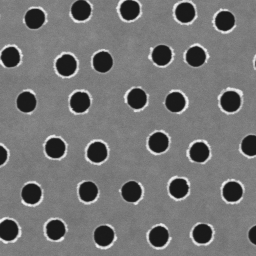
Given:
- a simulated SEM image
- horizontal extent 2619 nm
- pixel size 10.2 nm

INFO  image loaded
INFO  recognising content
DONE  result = a regular array of holes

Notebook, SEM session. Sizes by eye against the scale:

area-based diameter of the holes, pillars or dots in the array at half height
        203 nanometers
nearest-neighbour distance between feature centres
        428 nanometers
